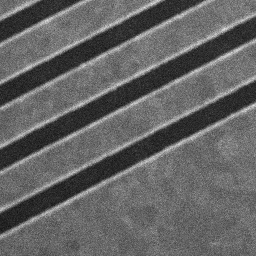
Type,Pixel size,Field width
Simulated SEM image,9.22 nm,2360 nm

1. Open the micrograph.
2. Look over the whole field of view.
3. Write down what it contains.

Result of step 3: parallel lines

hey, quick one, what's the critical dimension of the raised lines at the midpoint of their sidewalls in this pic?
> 303 nm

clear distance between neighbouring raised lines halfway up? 215 nm